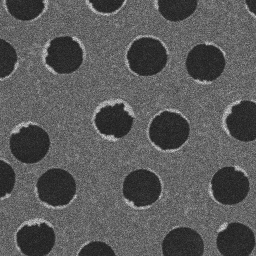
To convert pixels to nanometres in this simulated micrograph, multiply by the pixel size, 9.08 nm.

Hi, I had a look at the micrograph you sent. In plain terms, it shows a regular array of holes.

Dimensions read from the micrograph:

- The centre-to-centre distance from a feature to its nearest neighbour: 0.533 microns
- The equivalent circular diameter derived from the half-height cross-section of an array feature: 351 nm